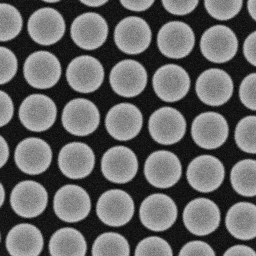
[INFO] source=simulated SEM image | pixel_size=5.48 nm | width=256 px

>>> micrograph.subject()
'an array of small figures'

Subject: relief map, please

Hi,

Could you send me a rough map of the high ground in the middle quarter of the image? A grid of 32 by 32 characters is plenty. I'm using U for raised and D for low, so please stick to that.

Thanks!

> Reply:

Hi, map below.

DUUUUUUUUDDDDUUUUUUUDDDDDUUUUDDD
DUUUUUUUUUDDUUUUUUUUDDDUUUUUUUDD
DUUUUUUUUUDDUUUUUUUUUDDUUUUUUUUD
DUUUUUUUUUDUUUUUUUUUUDUUUUUUUUUD
DUUUUUUUUUDUUUUUUUUUUDUUUUUUUUUD
DDUUUUUUUDDDUUUUUUUUDDUUUUUUUUUD
DDDUUUUUDDDDUUUUUUUUDDDUUUUUUUUD
DDDDDDDDDDDDDDUUUUUDDDDUUUUUUUUD
DDDDDDDDDDDDDDDDDDDDDDDDUUUUUUDD
DUUUUUUDDDDDDDDDDDDDDDDDDDDDDDDD
UUUUUUUUDDDDDUUUUDDDDDDDDDDDDDDD
UUUUUUUUUDDDUUUUUUUDDDDUUUUUDDDD
UUUUUUUUUDDUUUUUUUUDDDUUUUUUUDDD
UUUUUUUUUDUUUUUUUUUUDUUUUUUUUUDD
UUUUUUUUUDUUUUUUUUUUDUUUUUUUUUDD
UUUUUUUUDDUUUUUUUUUDDUUUUUUUUUDD
DUUUUUUUDDDUUUUUUUUDDUUUUUUUUUDD
DDUUUUDDDDDUUUUUUUDDDDUUUUUUUUDD
DDDDDDDDDDDDDUUUUDDDDDUUUUUUUDDD
DDDDDDDDDDDDDDDDDDDDDDDUUUUUDDDD
UUUUUUDDDDDDDDUDDDDDDDDDDDDDDDDD
UUUUUUUDDDDUUUUUUDDDDDDDDDDDDDDD
UUUUUUUDDDUUUUUUUUDDDDUUUUUDDDDD
UUUUUUUUDDUUUUUUUUDDDUUUUUUUDDDD
UUUUUUUUDUUUUUUUUUDDUUUUUUUUUDDD
UUUUUUUDDUUUUUUUUUDDUUUUUUUUUDDU
UUUUUUUDDUUUUUUUUUDDUUUUUUUUUDDU
UUUUUUDDDDUUUUUUUUDDUUUUUUUUUDDU
DUUUDDDDDDDUUUUUUDDDDUUUUUUUUDDU
DDDDDDDDDDDDUUUUDDDDDUUUUUUUDDDU
UUUUDDDDDDDDDDDDDDDDDDDUUUUDDDDD
UUUUUDDDDDDDUUDDDDDDDDDDDDDDDDDD